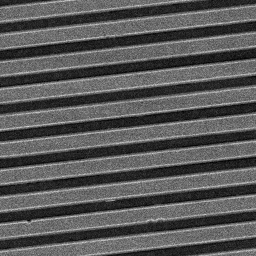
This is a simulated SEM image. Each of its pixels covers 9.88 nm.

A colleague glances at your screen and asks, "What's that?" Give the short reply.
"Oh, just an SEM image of parallel lines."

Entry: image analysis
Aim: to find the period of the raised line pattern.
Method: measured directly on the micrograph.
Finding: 266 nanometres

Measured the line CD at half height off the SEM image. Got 0.15 µm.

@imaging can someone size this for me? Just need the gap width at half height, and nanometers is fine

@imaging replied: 113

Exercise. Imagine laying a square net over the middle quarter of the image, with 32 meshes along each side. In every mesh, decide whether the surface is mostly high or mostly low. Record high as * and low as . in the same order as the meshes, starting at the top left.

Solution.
*******.........................
........................********
...............*****************
.......*************************
********************************
***********************.........
***************.................
****............................
.......................*********
...............*****************
......**************************
*****************************...
********************............
************....................
***..........................***
.....................***********
............********************
...*****************************
**************************......
******************..............
*********.......................
...........................*****
..................**************
.........***********************
.*******************************
**************************......
*****************...............
********........................
..........................******
.................***************
.........***********************
********************************